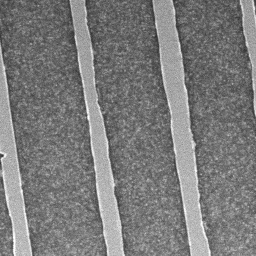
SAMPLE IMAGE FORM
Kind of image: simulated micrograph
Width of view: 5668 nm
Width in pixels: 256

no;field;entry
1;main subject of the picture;one or a few lines or trenches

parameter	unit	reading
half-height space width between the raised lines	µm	1.49